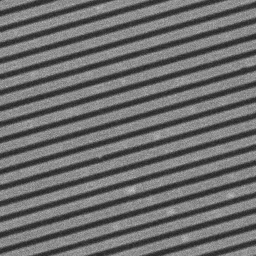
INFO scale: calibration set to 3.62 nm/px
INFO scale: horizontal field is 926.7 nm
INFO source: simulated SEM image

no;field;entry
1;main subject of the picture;parallel lines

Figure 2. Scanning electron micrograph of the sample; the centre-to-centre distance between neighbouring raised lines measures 15.2 pixels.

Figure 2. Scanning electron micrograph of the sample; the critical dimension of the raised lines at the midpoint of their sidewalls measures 32.6 nanometers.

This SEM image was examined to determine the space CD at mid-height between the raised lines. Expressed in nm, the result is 21.8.